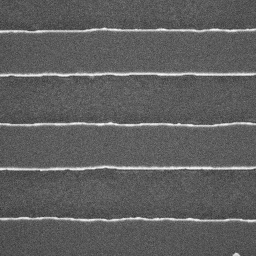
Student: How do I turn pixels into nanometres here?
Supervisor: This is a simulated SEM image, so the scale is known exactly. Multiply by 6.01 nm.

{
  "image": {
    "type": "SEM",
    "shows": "lines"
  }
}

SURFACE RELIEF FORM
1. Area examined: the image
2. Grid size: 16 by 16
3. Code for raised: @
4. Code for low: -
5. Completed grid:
----------------
----------------
@@@@@@@@@@@@@@@@
@@@@@@@@@@@@@@@@
@@@@@@@@@@@@@@@@
----------------
----------------
----------------
@@@@@@@@@@@@@@@@
@@@@@@@@@@@@@@@@
@@@@@@-@@@@@@@@@
----------------
----------------
----------------
@@@@@@@@@@@@@@@@
@@@@@@@@@@@@@@@@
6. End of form